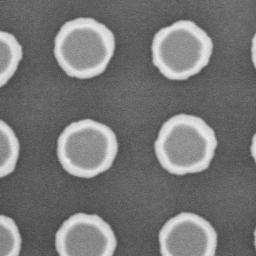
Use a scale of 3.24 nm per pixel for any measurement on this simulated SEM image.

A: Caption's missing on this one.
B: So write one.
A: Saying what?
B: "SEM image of raised bodies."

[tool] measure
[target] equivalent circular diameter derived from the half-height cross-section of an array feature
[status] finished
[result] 174 nanometres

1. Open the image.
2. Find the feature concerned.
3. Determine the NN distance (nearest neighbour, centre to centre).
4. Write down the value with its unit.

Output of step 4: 310 nanometres